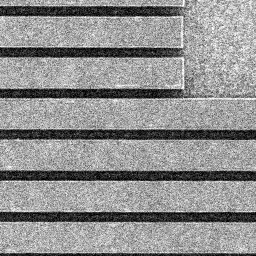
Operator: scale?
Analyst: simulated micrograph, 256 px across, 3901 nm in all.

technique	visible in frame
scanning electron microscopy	parallel lines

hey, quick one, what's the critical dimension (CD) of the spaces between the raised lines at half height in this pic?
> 10.1 px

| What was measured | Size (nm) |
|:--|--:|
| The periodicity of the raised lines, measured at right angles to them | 627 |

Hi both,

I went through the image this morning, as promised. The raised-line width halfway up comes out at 465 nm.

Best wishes